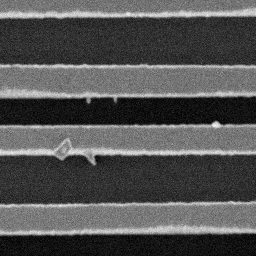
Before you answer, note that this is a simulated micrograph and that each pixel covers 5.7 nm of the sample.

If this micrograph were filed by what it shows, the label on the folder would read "lines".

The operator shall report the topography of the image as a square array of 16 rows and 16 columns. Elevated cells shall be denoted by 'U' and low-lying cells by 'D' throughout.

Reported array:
UUUUUUUUUUUUUUUU
DDDDDDDDDDDDDDDD
DDDDDDDDDDDDDDDD
DDDDDDDDDDDDDDDD
UUUUUUUUUUUUUUUU
UUUUUUUUUUUUUUUU
DDDDDDDDDDDDDDDD
DDDDDDDDDDDDDDDD
UUUUUUUUUUUUUUUU
UUUUUUUUUUUUUUUU
DDDDDDDDDDDDDDDD
DDDDDDDDDDDDDDDD
DDDDDDDDDDDDDDDD
UUUUUUUUUUUUUUUU
UUUUUUUUUUUUUUUU
DDDDDDDDDDDDDDDD